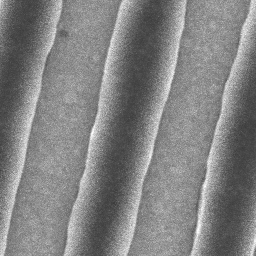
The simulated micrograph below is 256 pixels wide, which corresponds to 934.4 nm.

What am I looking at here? one or a few lines or trenches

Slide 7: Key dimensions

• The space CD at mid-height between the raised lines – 212 nm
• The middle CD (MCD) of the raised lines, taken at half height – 234 nm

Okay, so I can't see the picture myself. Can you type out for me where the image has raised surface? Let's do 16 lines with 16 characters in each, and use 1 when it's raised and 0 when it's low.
1111000111110000
1111000111100001
1110000111100001
1110000111100001
1110001111100011
1110001111100011
1100001111000011
1100001111000011
1100001111000111
1100001111000111
1000011110000111
1000011110000111
1000011110000111
1000111110001111
0000111100001111
0000111100001111